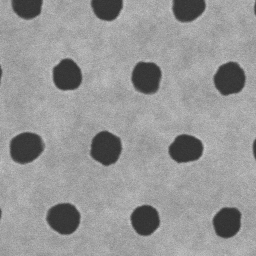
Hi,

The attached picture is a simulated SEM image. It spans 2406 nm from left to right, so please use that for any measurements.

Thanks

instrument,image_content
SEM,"a regular array of holes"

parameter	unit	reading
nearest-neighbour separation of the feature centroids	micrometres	0.753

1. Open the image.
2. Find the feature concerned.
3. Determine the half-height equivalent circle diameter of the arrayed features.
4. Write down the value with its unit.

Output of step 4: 295 nm